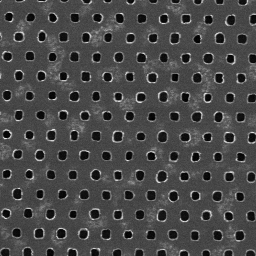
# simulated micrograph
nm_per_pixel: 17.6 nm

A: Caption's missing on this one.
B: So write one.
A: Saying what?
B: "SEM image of a regular array of holes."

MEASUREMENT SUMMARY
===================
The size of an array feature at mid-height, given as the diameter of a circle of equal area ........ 0.158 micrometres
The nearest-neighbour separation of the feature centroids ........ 385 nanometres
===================